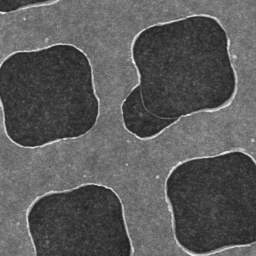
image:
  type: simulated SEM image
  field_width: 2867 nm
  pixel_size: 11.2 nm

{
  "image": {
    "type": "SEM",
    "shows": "holes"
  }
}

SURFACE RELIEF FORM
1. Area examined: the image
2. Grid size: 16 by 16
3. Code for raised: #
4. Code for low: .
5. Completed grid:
.###############
##########....##
#########.....##
#....###......##
......###......#
......##.......#
......##......##
......##...#####
#....###########
################
###########.....
##########......
##.....####.....
##......###.....
##......###.....
##......####..##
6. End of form